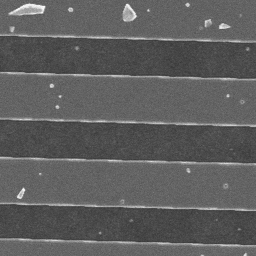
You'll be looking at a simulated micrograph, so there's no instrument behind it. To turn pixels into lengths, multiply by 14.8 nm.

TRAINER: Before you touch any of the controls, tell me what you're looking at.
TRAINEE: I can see lines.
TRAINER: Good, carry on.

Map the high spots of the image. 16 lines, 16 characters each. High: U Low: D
UUUUUUUUUUUUUUUU
UUUUUUUUUUUUUUUU
DDDDDDDDDDDDUUUU
DDDDDDDDDDDDDDDD
DDDDDDDDDDDDDDDD
UUUUUUUUUUUUUUUU
UUUUUUUUUUUUUUUU
DDDUUUUUUUUUUUUU
DDDDDDDDDDDDDDDD
DDDDDDDDDDDDDDDD
UUUUUUUUUUUUUUUU
UUUUUUUUUUUUUUUU
UUUUUUUUUUUUUUUU
DDDDDDDDDDDDDDDD
DDDDDDDDDDDDDDDD
UUUUUUUUUUUUUUUU